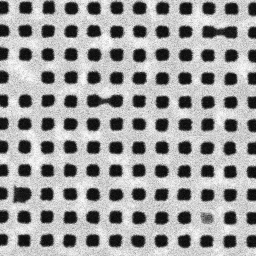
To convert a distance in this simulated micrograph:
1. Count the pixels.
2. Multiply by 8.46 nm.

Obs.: a regular array of holes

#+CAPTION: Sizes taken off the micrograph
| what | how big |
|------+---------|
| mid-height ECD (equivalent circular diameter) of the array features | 120 nanometres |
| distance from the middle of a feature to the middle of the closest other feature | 192 nm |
